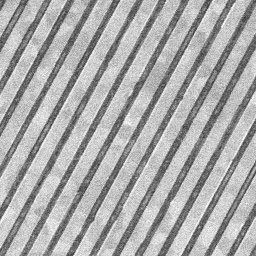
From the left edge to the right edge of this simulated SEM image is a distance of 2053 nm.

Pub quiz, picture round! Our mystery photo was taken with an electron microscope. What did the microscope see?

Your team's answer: parallel lines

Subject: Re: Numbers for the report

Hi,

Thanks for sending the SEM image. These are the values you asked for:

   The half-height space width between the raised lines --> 62.5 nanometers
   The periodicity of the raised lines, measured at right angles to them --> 162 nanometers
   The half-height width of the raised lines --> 12.2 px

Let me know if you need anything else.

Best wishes